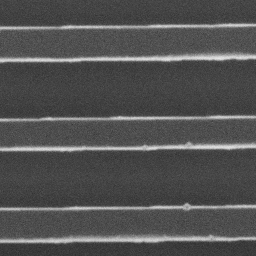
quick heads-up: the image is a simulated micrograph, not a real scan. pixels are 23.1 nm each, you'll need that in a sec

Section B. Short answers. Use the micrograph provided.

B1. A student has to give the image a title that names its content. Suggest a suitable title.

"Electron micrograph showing lines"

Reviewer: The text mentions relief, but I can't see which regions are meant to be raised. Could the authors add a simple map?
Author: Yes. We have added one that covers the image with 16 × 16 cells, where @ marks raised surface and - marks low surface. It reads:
----------------
----------------
@@@@@@@@@@@@@@@@
@@@@@@@@@@@@@@@@
----------------
----------------
----------------
@@@@@@@@@@@@@@@@
@@@@@@@@@@@@@@@@
----------------
----------------
----------------
----------------
@@@@@@@@@@@@@@@@
@@@@@@@@@@@@@@@@
----------------